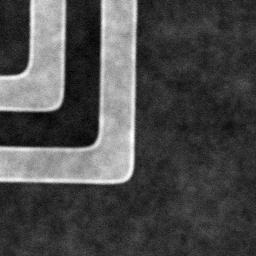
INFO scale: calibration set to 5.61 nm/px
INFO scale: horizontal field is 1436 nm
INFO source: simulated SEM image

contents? groups of lines, slits or small figures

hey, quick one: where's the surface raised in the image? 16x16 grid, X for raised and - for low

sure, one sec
--XX--XX--------
--XX--XX--------
--XX--XX--------
--XX--XX--------
-XXX--XX--------
XXXX--XX--------
XXXX--XX--------
------XX--------
------XX--------
XXXXXXXX--------
XXXXXXXX--------
----------------
----------------
----------------
----------------
----------------